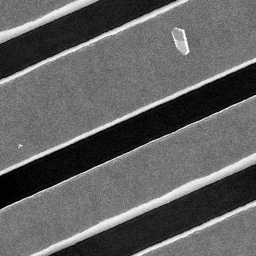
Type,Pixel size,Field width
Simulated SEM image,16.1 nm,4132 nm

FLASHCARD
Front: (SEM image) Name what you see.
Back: lines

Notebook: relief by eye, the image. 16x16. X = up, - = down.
XXXXX-----XXXXXX
XX------XXXXXXXX
------XXXXXXXXXX
---XXXXXXXXXXXXX
-XXXXXXXXXXXXXX-
XXXXXXXXXXXX----
XXXXXXXXXX-----X
XXXXXXXX-----XXX
XXXXXX----XXXXXX
XXX-----XXXXXXXX
X-----XXXXXXXXX-
----XXXXXXXXX---
-XXXXXXXXX------
XXXXXXXX------XX
XXXXXX------XXXX
XXXX-----XXXXXXX